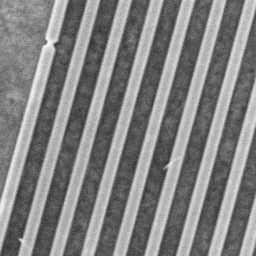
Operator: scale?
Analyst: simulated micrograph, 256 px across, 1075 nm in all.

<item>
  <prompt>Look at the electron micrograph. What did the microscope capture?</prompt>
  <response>parallel lines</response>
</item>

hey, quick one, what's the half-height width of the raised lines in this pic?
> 0.0502 um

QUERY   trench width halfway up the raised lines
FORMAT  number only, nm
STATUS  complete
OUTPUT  79.1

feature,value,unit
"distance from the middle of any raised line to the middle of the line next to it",0.128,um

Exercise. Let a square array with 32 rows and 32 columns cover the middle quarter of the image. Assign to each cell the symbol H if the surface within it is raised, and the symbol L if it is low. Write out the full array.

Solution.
LLHHLLLLLLHHLLLLLHHHLLLLLHHHLLLL
LHHHLLLLLHHHLLLLLHHHLLLLLHHHLLLL
LHHHLLLLLHHHLLLLLHHHLLLLLHHHLLLL
LHHHLLLLLHHHLLLLHHHLLLLLHHHLLLLL
HHHLLLLLHHHLLLLLHHHLLLLLHHHLLLLL
HHHLLLLLHHHLLLLLHHHLLLLLHHHLLLLL
HHHLLLLLHHHLLLLLHHHLLLLLHHLLLLLH
HHLLLLLLHHLLLLLHHHLLLLLHHHLLLLLH
HHLLLLLHHHLLLLLHHHLLLLLHHHLLLLLH
HHLLLLLHHHLLLLLHHHLLLLLHHHLLLLLH
HHLLLLLHHHLLLLLHHHLLLLLHHLLLLLHH
HLLLLLHHHLLLLLHHHLLLLLHHHLLLLLHH
HLLLLLHHHLLLLLHHHLLLLLHHHLLLLLHH
HLLLLLHHHLLLLLHHHLLLLLHHHLLLLHHH
HLLLLLHHHLLLLHHHHLLLLHHHLLLLLHHH
LLLLLHHHLLLLLHHHLLLLLHHHLLLLLHHH
LLLLLHHHLLLLLHHHLLLLLHHHLLLLLHHH
LLLLLHHHLLLLLHHLLLLLLHHLLLLLLHHL
LLLLHHHLLLLLHHHLLLLLHHHLLLLLHHHL
LLLLHHHLLLLLHHHLLLLLHHHLLLLLHHHL
LLLLHHHLLLLLHHHLLLLLHHHLLLLLHHHL
LLLLHHHLLLLLHHLLLLLLHHLLLLLHHHLL
LLLHHHLLLLLHHHLLLLLHHHLLLLLHHHLL
LLLHHHLLLLLHHHLLLLLHHHLLLLLHHHLL
LLLHHHLLLLLHHHLLLLLHHHLLLLLHHHLL
LLLHHHLLLLHHHLLLLLHHHLLLLLHHHLLL
LLHHHLLLLLHHHLLLLLHHHLLLLLHHHLLL
LLHHHLLLLLHHHLLLLLHHHLLLLLHHHLLL
LLHHHLLLLLHHHLLLLLHHLLLLLHHHLLLL
LHHHLLLLLHHHLLLLLHHHLLLLLHHHLLLL
LHHHLLLLLHHHLLLLLHHHLLLLLHHHLLLL
LHHHLLLLLHHHLLLLLHHHLLLLLHHHLLLL